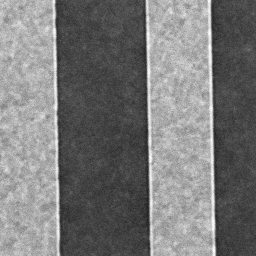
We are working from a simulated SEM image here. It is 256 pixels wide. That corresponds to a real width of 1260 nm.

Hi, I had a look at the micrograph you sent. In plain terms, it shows one or a few lines or trenches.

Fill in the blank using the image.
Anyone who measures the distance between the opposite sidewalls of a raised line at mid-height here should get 310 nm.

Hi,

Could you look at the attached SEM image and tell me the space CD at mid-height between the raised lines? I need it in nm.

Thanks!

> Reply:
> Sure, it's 454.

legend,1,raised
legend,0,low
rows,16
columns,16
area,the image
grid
1110000001111000
1110000001111000
1110000001111000
1110000001111000
1110000001111000
1110000001111000
1111000001111000
1111000001111000
1111000001111000
1111000001111000
1111000001111000
1111000001111000
1111000001111000
1111000001111000
1111000001111000
1111000001111000